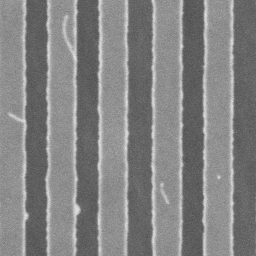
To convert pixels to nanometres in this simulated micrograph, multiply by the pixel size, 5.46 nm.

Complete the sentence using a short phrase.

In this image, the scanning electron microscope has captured lines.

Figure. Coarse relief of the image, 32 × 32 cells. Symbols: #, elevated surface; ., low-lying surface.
###...####..####...####...###...
###...####..####...####...###...
###...###...####...####...###...
###...###...####...####...###...
###...###....###...####..####...
###...###...####...####...###...
###...###...####...####...###...
###...####..####...####...###...
###...###...####...####..####...
###...###...####...####..####...
###...###...####...####..####...
###...###...####...####..####...
###...###...####...####..####...
###...###...####...####..####...
###...###...####...####..####...
###...###...####...####...###...
###...###...####...####..####...
###...###...####...####...###...
###...###...####...####..####...
###...###...####...####..####...
###...###...####...####...###...
###...###...####...####..####...
###...####..####...####..####...
###...###...####...####..####...
###...###...####...####..####...
###...###...####...####..####...
###...###...####...####..####...
###...###...####...####..####...
###...###...####...####..####...
###...###...####...####..####...
###...###...####...####..####...
###...###...####...####..####...